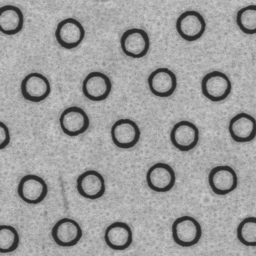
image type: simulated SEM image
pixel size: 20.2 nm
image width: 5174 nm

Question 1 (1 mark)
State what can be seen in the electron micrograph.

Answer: a regular array of ring-shaped grooves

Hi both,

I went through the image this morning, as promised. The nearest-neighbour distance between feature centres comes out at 1070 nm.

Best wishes